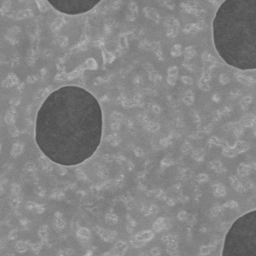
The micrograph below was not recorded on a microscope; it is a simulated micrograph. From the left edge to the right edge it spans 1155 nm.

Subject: holes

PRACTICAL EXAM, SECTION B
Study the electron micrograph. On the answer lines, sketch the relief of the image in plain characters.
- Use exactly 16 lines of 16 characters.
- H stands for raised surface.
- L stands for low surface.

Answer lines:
HHHLLLHHHHHHHHLL
HHHHHHHHHHHHHLLL
HHHHHHHHHHHHHLLL
HHHHHHHHHHHHHHLL
HHHHHHHHHHHHHHHH
HHHHLHHHHHHHHHHH
HHHLLLHHHHHHHHHH
HHLLLLHHHHHHHHHH
HHLLLLHHHHHHHHHH
HHHLLLHHHHHHHHHH
HHHHHHHHHHHHHHHH
HHHHHHHHHHHHHHHH
HHHHHHHHHHHHHHHH
HHHHHHHHHHHHHHHL
HHHHHHHHHHHHHHLL
HHHHHHHHHHHHHHLL